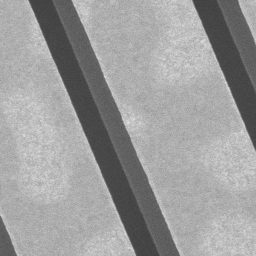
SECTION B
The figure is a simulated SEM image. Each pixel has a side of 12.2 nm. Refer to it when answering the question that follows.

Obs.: lines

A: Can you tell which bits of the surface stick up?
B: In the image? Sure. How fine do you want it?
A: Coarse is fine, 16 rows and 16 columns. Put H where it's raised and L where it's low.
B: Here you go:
HHLLLHHHHHHHLLLH
HHLLLHHHHHHHHLLL
HHHLLLHHHHHHHLLL
HHHLLLHHHHHHHLLL
HHHHLLHHHHHHHHLL
HHHHLLLHHHHHHHLL
HHHHLLLHHHHHHHHL
HHHHHLLLHHHHHHHL
HHHHHLLLHHHHHHHH
HHHHHHLLLHHHHHHH
HHHHHHLLLHHHHHHH
HHHHHHHLLHHHHHHH
HHHHHHHLLLHHHHHH
HHHHHHHLLLHHHHHH
HHHHHHHHLLLHHHHH
LHHHHHHHLLLHHHHH